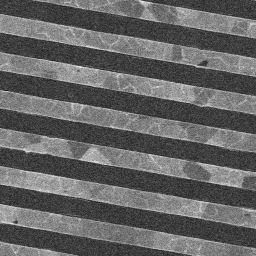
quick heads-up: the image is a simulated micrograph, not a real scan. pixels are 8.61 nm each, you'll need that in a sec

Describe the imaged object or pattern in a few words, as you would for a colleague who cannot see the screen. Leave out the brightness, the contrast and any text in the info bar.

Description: parallel lines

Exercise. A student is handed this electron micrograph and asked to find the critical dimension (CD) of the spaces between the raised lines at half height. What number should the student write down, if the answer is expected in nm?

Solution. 169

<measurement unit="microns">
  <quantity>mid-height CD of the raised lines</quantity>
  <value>0.153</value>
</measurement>